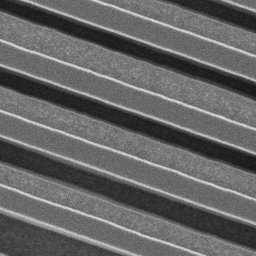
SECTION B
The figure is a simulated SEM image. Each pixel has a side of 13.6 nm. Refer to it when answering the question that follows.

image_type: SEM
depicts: lines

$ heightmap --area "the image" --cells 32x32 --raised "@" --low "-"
----@@@@@@@@@@@@@@@@@--------@@@
-------@@@@@@@@@@@@@@@@@--------
@@@-------@@@@@@@@@@@@@@@@@-----
@@@@@@------@@@@@@@@@@@@@@@@@@--
@@@@@@@@@------@@@@@@@@@@@@@@@@@
@@@@@@@@@@@@------@@@@@@@@@@@@@@
@@@@@@@@@@@@@@-------@@@@@@@@@@@
@@@@@@@@@@@@@@@@@-------@@@@@@@@
-@@@@@@@@@@@@@@@@@@@-------@@@@@
----@@@@@@@@@@@@@@@@@@@-------@@
------@@@@@@@@@@@@@@@@@@@@------
@@-------@@@@@@@@@@@@@@@@@@@@---
@@@@@-------@@@@@@@@@@@@@@@@@@@@
@@@@@@@@-------@@@@@@@@@@@@@@@@@
@@@@@@@@@@@-------@@@@@@@@@@@@@@
@@@@@@@@@@@@@@-------@@@@@@@@@@@
@@@@@@@@@@@@@@@@--------@@@@@@@@
-@@@@@@@@@@@@@@@@@@--------@@@@@
----@@@@@@@@@@@@@@@@@@-------@@@
-------@@@@@@@@@@@@@@@@@@-------
----------@@@@@@@@@@@@@@@@@@----
@@@----------@@@@@@@@@@@@@@@@@@-
@@@@@@----------@@@@@@@@@@@@@@@@
@@@@@@@@@---------@@@@@@@@@@@@@@
@@@@@@@@@@@@---------@@@@@@@@@@@
@@@@@@@@@@@@@@----------@@@@@@@@
-@@@@@@@@@@@@@@@@----------@@@@@
----@@@@@@@@@@@@@@@@----------@@
-------@@@@@@@@@@@@@@@@---------
----------@@@@@@@@@@@@@@@@------
------------@@@@@@@@@@@@@@@@@---
---------------@@@@@@@@@@@@@@@@@